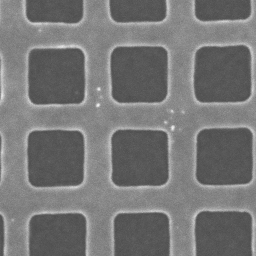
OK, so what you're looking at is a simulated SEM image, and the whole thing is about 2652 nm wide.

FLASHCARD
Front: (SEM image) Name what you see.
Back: holes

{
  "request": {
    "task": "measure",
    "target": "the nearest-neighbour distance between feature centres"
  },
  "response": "852 nm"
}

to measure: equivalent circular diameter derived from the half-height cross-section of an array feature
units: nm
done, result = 657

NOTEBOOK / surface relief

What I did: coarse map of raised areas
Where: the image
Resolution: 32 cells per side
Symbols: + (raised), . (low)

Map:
+++.......++++.......+++.......+
+++.......++++.......+++.......+
++++......++++......+++++.....++
++++++++++++++++++++++++++++++++
++++++++++++++++++++++++++++++++
++++++++++++++++++++++++++++++++
++++......++++.......++++......+
+++........+++.......+++.......+
+++........+++.......+++.......+
+++........+++.......+++.......+
++++.......+++.......+++.......+
+++........+++.......+++.......+
++++......++++......+++++......+
++++++++++++++++++++++++++++++++
++++++++++++++++++++++++++++++++
++++++++++++++++++++++++++++++++
++++......++++.......++++......+
+++........+++.......+++........
+++........+++.......++++.......
+++........+++.......++++.......
+++........+++.......++++.......
+++........+++.......+++........
++++......++++.......++++......+
++++++++++++++++++++++++++++++++
++++++++++++++++++++++++++++++++
++++++++++++++++++++++++++++++++
+++++++++++++++++++++++++......+
++++.......+++.......+++........
.++........+++.......+++........
.+++.......+++.......+++........
.+++.......+++.......+++.......+
.+++.......+++.......+++........